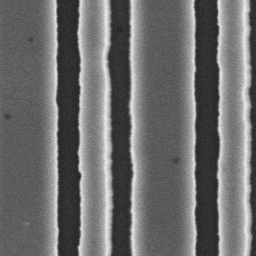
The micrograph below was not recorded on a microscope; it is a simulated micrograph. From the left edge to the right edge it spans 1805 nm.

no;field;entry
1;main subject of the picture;lines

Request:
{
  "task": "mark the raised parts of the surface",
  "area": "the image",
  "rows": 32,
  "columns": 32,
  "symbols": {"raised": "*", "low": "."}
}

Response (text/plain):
*******...***....*******...****.
*******...***....*******...****.
*******...***...********...****.
*******...***....*******...****.
*******...***...********...****.
*******...***...********...****.
*******...***...********...****.
*******...***...********...****.
*******...***...********...****.
*******...***....*******...****.
*******...****...*******...****.
*******...****...*******...****.
*******...***...********...****.
*******...***...********...****.
*******...***....*******...****.
*******...***....*******...****.
*******...***....*******...****.
*******...***...********....***.
*******...****..********....***.
*******...***....*******...****.
*******...****...*******...****.
*******...***....*******...****.
*******...****...*******...****.
*******...****...*******...****.
*******...****...*******...****.
*******...****...*******...****.
*******...****...*******...****.
*******...****...*******...****.
*******...****...*******...****.
*******...****...*******...****.
*******...****...*******...****.
*******...****...*******...****.